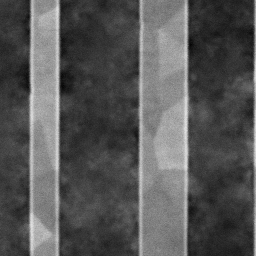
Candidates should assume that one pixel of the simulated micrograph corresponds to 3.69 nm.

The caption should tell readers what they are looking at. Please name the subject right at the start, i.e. one or a few lines or trenches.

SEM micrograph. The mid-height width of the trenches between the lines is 306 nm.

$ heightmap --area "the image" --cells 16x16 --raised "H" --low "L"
LLHHLLLLLHHHLLLL
LLHHLLLLLHHHLLLL
LLHHLLLLLHHHLLLL
LLHHLLLLLHHHLLLL
LLHHLLLLLHHHLLLL
LLHHLLLLLHHHLLLL
LLHHLLLLLHHHLLLL
LLHHLLLLLHHHLLLL
LLHHLLLLLHHHLLLL
LLHHLLLLLHHHLLLL
LLHHLLLLLHHHLLLL
LLHHLLLLLHHHLLLL
LLHHLLLLLHHHLLLL
LLHHLLLLLHHHLLLL
LLHHLLLLLHHHLLLL
LLHHLLLLLHHHLLLL